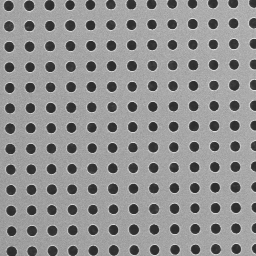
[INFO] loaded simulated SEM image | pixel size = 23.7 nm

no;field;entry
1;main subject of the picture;a regular array of holes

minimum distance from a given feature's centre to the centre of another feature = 20.2 px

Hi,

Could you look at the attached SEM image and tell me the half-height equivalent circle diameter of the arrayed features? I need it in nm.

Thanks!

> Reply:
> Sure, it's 239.